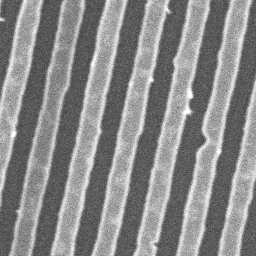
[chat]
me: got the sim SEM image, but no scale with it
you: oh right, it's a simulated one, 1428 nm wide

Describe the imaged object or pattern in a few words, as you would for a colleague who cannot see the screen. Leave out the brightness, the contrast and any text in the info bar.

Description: parallel lines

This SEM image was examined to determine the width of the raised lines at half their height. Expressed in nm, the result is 106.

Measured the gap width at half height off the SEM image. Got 121 nm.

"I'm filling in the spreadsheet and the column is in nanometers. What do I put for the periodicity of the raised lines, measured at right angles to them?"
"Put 228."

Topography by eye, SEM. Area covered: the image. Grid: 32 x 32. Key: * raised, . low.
...**...**...***..***...**...**.
...**...**...**...***...**...**.
..***..***...**...**...***..***.
..***..***..***...**...**...***.
..**...***..***...**...**...**..
..**...**...***..***...**...**..
..**...**...**...***..***...**..
.***..***...**...**...***..***..
.***..***..***...**...**...***..
.**...***..***...**...**...**...
.**...***..***..***...**...**...
***...**...**...**...***...**...
***...**...**...**...***..***..*
**...***..***...**...***..**...*
**...**...***..***...**...**...*
**...**...**...***..***...**...*
**...**...***..***..***..***...*
**..***...**...**...**....**..**
*...***..***...**...**...***..**
*...**...***..***..***...**...**
*...**...***..***..***...**...**
*..***...**...**...**...***...**
...***...**...**...**...***..***
...***..***..***...**...**...***
...**...**...***..***...**...**.
...**...**...***..***..***...**.
..***...**...**...***..***..***.
..***..***...**...**...***..***.
..**...***..***...**...**...**..
..**...**...***..***...**...**..
..**...**...**...**...***...**..
.***...**...**...**...***..***..